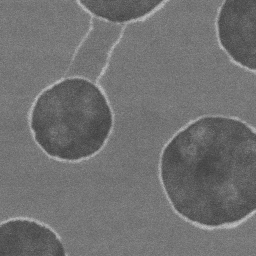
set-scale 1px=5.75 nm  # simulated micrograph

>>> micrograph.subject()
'holes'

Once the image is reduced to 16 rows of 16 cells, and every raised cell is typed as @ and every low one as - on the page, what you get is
@@@@@-----@@@@--
@@@@@@--@@@@@@--
@@@@@--@@@@@@@--
@@@@@--@@@@@@@--
@@@@--@@@@@@@@@@
@@@---@@@@@@@@@@
@@-----@@@@@@@@@
@@-----@@@@@---@
@@-----@@@@-----
@@@---@@@@------
@@@@@@@@@@------
@@@@@@@@@@------
@@@@@@@@@@@-----
@@@@@@@@@@@----@
---@@@@@@@@@@@@@
----@@@@@@@@@@@@